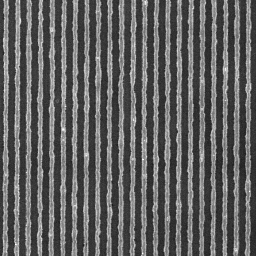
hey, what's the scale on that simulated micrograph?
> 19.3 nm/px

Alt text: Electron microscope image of parallel lines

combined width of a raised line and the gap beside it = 0.223 um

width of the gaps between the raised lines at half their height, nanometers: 147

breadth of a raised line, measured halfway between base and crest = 0.082 micrometres